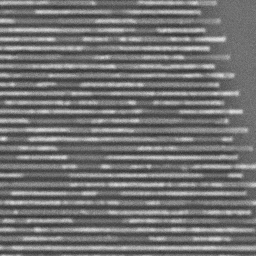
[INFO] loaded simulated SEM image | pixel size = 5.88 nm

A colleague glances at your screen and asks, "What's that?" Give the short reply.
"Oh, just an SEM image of parallel lines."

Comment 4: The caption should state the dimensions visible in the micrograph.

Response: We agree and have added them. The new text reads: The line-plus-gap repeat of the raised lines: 9.06 px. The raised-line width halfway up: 22.1 nm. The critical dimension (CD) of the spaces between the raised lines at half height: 33.8 nanometers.